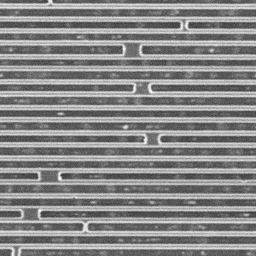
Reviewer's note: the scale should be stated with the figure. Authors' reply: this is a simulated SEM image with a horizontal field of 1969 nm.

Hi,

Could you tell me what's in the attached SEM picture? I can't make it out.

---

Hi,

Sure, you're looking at parallel lines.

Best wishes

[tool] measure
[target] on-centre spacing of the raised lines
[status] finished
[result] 0.0974 um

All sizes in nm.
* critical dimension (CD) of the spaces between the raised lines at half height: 68.3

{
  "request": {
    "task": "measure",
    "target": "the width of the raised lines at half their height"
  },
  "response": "0.0308 micrometres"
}